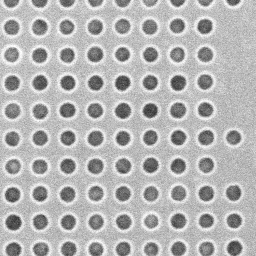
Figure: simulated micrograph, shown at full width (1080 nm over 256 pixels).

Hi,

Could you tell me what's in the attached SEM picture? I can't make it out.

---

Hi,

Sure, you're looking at a regular array of holes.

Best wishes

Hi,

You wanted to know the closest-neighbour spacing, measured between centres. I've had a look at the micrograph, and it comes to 115 nm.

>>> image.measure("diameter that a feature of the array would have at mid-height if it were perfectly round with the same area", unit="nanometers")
68.1